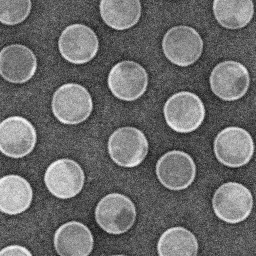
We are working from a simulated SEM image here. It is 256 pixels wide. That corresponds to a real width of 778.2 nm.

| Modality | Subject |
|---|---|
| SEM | a regular array of raised bodies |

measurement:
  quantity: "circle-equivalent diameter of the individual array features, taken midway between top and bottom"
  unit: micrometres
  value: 0.118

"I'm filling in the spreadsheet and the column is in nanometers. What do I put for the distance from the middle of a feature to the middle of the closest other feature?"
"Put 174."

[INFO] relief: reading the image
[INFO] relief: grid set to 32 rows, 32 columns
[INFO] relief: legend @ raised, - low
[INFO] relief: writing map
@@@@---------@@@@----------@@@@@
@@@@---------@@@@@---------@@@@@
@@@----------@@@@----------@@@@-
---------@@----@------@@-----@--
--------@@@@---------@@@@-------
-------@@@@@--------@@@@@-------
@@@@----@@@@---------@@@@-------
@@@@-----@@----------@@@--------
@@@@----------@@@@---------@@@@-
@@@@----------@@@@--------@@@@@-
--------------@@@@--------@@@@@-
-------@@@@---@@@@---------@@@@-
-------@@@@----------@@@@-------
-------@@@@----------@@@@-------
-------@@@@----------@@@@-------
@@@@-----------------@@@@-------
@@@@----------@@@-----------@@@-
@@@@----------@@@@---------@@@@-
@@@@----------@@@@---------@@@@@
-@@-----------@@@@--@@@----@@@@-
-------@@@-----@@---@@@@----@@--
------@@@@----------@@@@--------
@@@---@@@@----------@@@@--------
@@@@--@@@@-----------@@----@@@@-
@@@@---@@-----@------------@@@@-
@@@@--------@@@@-----------@@@@-
-@----------@@@@@----------@@@@-
------------@@@@@-----------@@--
--------@@@--@@@----------------
-------@@@@---------@@@@--------
-------@@@@@--------@@@@@-------
@@@----@@@@---------@@@@@-------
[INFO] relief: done